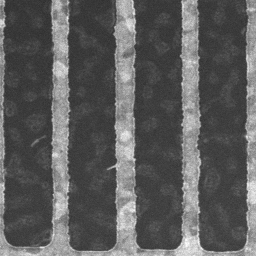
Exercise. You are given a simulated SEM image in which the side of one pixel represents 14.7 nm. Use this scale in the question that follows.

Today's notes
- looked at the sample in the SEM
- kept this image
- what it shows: one or a few lines or trenches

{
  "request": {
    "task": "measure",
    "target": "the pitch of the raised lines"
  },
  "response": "952 nm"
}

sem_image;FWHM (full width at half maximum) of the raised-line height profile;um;0.237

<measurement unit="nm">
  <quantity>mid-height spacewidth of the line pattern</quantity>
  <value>711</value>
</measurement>